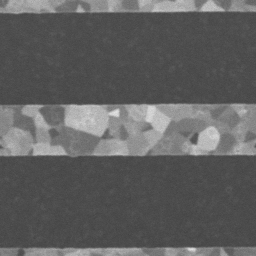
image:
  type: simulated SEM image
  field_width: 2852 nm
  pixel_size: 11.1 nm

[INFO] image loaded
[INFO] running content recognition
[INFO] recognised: one or a few lines or trenches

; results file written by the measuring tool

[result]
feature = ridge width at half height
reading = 556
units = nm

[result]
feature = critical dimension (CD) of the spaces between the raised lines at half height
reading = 1040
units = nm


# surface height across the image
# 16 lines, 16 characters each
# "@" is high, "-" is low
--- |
@@@@@@@@@@@@@@@@
----------------
----------------
----------------
----------------
----------------
----------------
@@@@@@@@@@@@@@@@
@@@@@@@@@@@@@@@@
@@@@@@@@@@@@@@@@
----------------
----------------
----------------
----------------
----------------
------------@@@@